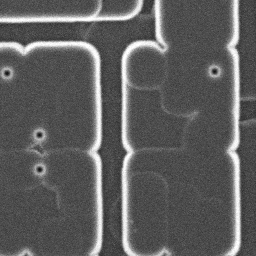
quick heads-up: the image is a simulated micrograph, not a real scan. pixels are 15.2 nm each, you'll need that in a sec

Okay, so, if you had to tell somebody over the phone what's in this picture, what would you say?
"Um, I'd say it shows wiring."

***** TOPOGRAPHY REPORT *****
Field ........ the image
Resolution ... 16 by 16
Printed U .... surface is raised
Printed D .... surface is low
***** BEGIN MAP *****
UUUUUUUUUDUUUUUD
DDDDDDDDDDUUUUUD
DDDDDDDDDDUUUUUD
UUUUUUDDUUUUUUUD
UUUUUUDDUUUUUUUD
UUUUUUDDUUUUUUUD
UUUUUUDDUUUUUUUD
UUUUUUDDUUUUUUUD
UUUUUUDDUUUUUUUD
UUUUUUDDUUUUUUUD
UUUUUUDDUUUUUUUD
UUUUUUDDUUUUUUUD
UUUUUUDDUUUUUUUD
UUUUUUDDUUUUUUUD
UUUUUUDDUUUUUUUD
UUUUUUDDUUUUUUUD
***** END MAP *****